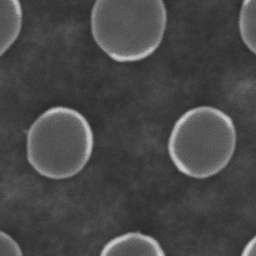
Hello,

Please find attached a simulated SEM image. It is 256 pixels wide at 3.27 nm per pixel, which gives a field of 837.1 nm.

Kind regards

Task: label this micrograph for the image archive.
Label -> raised bodies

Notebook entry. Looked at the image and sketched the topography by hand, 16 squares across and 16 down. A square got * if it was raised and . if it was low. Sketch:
*.....****.....*
*.....****.....*
*.....****.....*
.......**.......
................
................
................
..***......***..
..****.....****.
..****.....****.
..***......***..
................
................
................
................
*......***.....*